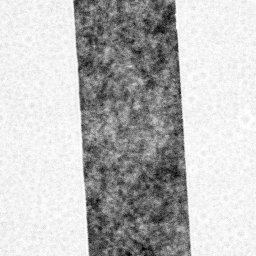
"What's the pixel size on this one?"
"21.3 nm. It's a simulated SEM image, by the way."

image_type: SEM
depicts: one or a few lines or trenches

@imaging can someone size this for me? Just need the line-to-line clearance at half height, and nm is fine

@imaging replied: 2200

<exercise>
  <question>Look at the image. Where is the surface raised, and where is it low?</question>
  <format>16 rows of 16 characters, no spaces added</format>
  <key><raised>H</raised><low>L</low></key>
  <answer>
HHHHHLLLLLLHHHHH
HHHHHLLLLLLHHHHH
HHHHHLLLLLLHHHHH
HHHHHLLLLLLHHHHH
HHHHHLLLLLLHHHHH
HHHHHLLLLLLHHHHH
HHHHHLLLLLLHHHHH
HHHHHLLLLLLHHHHH
HHHHHLLLLLLLHHHH
HHHHHLLLLLLLHHHH
HHHHHLLLLLLLHHHH
HHHHHLLLLLLLHHHH
HHHHHLLLLLLLHHHH
HHHHHLLLLLLLHHHH
HHHHHLLLLLLLHHHH
HHHHHLLLLLLLHHHH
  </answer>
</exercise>